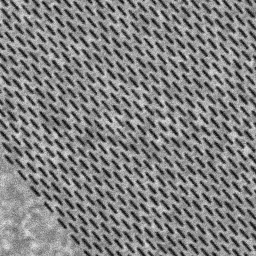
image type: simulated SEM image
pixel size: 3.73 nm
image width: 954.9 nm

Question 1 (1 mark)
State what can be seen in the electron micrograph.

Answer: a regular array of holes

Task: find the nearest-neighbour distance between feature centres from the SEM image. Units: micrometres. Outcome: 0.043